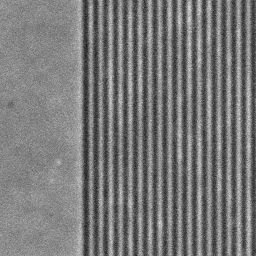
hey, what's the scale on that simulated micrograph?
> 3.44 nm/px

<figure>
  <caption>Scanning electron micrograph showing parallel lines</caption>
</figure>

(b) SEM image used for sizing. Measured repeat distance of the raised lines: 0.0338 micrometres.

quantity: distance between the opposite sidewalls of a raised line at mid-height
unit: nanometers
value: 6.4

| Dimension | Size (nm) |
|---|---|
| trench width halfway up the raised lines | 27.1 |